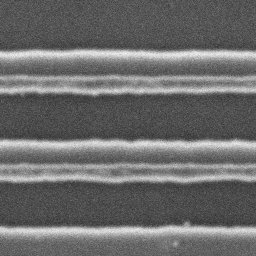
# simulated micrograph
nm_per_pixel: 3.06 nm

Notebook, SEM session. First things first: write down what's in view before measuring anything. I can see lines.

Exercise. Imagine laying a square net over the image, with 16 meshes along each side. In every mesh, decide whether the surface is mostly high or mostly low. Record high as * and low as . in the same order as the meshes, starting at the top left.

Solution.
................
................
................
****************
****************
****************
................
................
................
****************
****************
................
................
................
****************
****************